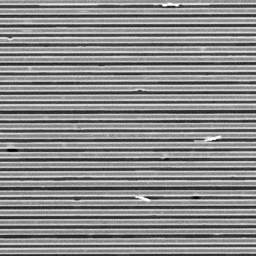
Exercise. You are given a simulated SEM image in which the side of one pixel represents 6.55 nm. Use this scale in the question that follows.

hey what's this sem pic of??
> parallel lines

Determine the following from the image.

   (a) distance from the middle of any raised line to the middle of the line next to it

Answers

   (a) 62.7 nanometers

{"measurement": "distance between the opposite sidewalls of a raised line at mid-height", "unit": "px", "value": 5.5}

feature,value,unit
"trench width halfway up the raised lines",29.5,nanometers